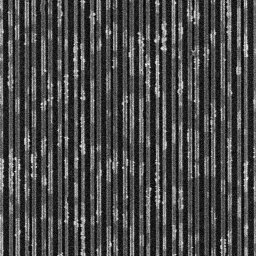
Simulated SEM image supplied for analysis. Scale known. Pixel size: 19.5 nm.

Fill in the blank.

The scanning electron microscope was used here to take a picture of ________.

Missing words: parallel lines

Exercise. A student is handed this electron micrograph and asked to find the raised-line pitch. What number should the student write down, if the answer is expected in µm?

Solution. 0.158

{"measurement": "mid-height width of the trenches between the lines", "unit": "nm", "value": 112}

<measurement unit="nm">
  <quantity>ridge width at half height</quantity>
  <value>75.7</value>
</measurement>